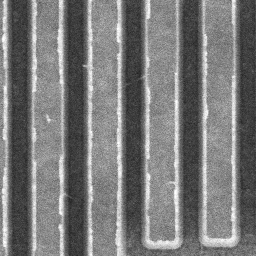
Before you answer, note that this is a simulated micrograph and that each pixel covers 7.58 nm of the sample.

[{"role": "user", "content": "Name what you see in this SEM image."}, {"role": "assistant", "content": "parallel lines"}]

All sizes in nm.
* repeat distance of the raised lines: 432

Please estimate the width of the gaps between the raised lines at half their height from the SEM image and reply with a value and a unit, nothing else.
0.165 um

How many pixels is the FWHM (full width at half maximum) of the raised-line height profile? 36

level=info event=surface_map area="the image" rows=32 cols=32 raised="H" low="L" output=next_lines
HLLLHHHHLLLHHHHLLLHHHHLLLHHHHLLL
HLLLHHHHLLLHHHHLLLHHHHLLLHHHHHLL
HLLLHHHHLLLHHHHLLLHHHHLLLHHHHHLL
HLLLHHHHLLLHHHHLLLHHHHLLLHHHHHLL
HLLLHHHHLLLHHHHLLLHHHHLLLHHHHHLL
HLLLHHHHLLLHHHHLLLHHHHLLLHHHHHLL
HLLLHHHHLLLHHHHLLLHHHHLLLHHHHHLL
HLLLHHHHLLLHHHHLLLHHHHLLLHHHHHLL
HLLLHHHHLLLHHHHLLLHHHHLLLHHHHHLL
HLLLHHHHLLLHHHHLLLHHHHLLLHHHHHLL
HLLLHHHHLLLHHHHLLLHHHHLLLHHHHHLL
HLLLHHHHLLLHHHHLLLHHHHLLLHHHHHLL
HLLLHHHHLLLHHHHLLLHHHHLLLHHHHHLL
HLLLHHHHLLLHHHHLLLHHHHLLLHHHHHLL
HLLLHHHHLLLHHHHLLLHHHHLLLHHHHHLL
HLLLHHHHLLLHHHHLLLHHHHLLLHHHHHLL
HLLLHHHHLLLHHHHLLLHHHHLLLHHHHLLL
HLLLHHHHLLLHHHHLLLHHHHLLLHHHHHLL
HLLLHHHHLLLHHHHLLLHHHHLLLHHHHLLL
HLLLHHHHLLLHHHHLLLHHHHLLLHHHHHLL
HLLLHHHHLLLHHHHLLLHHHHLLLHHHHLLL
HLLLHHHHLLLHHHHLLLHHHHLLLHHHHHLL
HLLLHHHHLLLHHHHLLLHHHHLLLHHHHHLL
HLLLHHHHLLLHHHHLLLHHHHLLLHHHHHLL
HLLLHHHHLLLHHHHLLLHHHHLLLHHHHHLL
HLLLHHHHLLLHHHHLLLHHHHLLLHHHHHLL
HLLLHHHHLLLHHHHLLLHHHHLLLHHHHHLL
HLLLHHHHLLLHHHHLLLHHHHLLLHHHHHLL
HLLLHHHHLLLHHHHLLLHHHHLLLHHHHHLL
HLLLHHHHLLLHHHHLLLHHHHLLLHHHHHLL
HLLLHHHHLLLHHHHLLLHHHHLLLLLLHLLL
HLLLHHHHLLLHHHHLLLLLLLLLLLLLLLLL